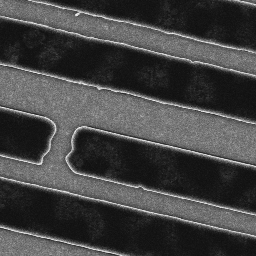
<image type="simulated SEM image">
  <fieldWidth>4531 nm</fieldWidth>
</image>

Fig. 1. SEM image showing one or a few lines or trenches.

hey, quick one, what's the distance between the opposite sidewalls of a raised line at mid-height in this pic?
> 841 nanometers